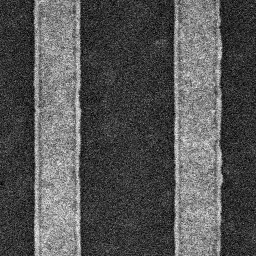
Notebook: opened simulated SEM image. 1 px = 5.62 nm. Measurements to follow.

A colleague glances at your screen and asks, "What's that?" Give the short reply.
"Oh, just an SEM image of one or a few lines or trenches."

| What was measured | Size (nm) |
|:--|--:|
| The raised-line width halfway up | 234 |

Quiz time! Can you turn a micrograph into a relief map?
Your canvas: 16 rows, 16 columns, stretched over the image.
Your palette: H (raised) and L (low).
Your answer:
LLHHHLLLLLLHHHLL
LLHHHLLLLLLHHHLL
LLHHHLLLLLLHHHLL
LLHHHLLLLLLHHHLL
LLHHHLLLLLLHHHLL
LLHHHLLLLLLHHHLL
LLHHHLLLLLLHHHLL
LLHHHLLLLLLHHHLL
LLHHHLLLLLLHHHLL
LLHHHLLLLLLHHHLL
LLHHHLLLLLLHHHLL
LLHHHLLLLLLHHHLL
LLHHHLLLLLLHHHLL
LLHHHLLLLLLHHHLL
LLHHHLLLLLLHHHLL
LLHHHLLLLLLHHHLL